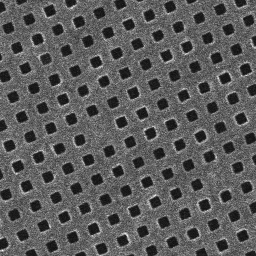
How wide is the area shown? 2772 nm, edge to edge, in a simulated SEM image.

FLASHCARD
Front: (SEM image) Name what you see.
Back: a regular array of holes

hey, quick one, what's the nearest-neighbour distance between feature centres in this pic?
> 0.234 um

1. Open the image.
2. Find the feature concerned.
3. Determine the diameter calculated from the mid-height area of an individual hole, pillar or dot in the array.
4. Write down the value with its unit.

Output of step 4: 11.9 pixels